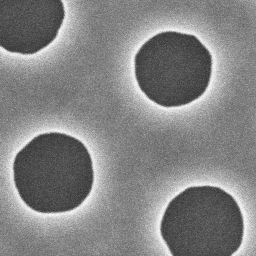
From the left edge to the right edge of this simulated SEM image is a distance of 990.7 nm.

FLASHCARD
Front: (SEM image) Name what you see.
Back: holes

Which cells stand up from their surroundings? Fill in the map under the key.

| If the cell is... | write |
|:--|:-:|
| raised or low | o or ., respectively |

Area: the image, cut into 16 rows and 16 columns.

....oooooooooooo
....oooooooooooo
...oooooo...oooo
oooooooo.....ooo
oooooooo.....ooo
ooooooooo....ooo
oooooooooo..oooo
oooooooooooooooo
oo..oooooooooooo
o.....oooooooooo
o.....oooooooooo
o.....oooooooooo
o....oooooo....o
oooooooooo.....o
oooooooooo.....o
ooooooooooo....o